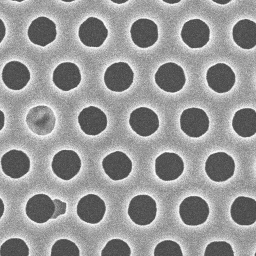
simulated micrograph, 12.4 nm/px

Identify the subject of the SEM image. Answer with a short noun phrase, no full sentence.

a regular array of holes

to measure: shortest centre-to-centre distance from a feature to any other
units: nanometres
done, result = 628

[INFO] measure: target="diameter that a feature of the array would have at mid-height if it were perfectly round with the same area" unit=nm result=364